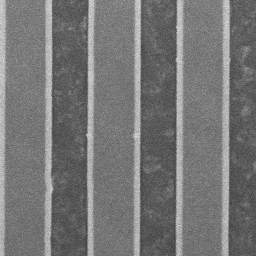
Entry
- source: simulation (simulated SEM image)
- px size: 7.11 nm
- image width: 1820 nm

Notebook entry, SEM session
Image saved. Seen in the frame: one or a few lines or trenches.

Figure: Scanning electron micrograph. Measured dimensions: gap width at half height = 293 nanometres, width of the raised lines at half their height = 341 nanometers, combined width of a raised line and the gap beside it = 0.631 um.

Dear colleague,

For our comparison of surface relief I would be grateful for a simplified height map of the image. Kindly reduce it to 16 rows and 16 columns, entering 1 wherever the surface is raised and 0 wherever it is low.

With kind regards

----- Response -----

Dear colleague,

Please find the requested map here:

1110001110011100
1110001110011100
1110001110011100
1110001110011100
1110001110011100
1110001110011100
1110001110011100
1110001110011100
1110001110011100
1110001110011100
1110001110011100
1110001110011100
1110001110011100
1110001110011100
1110001110011100
1110001110011100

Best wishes